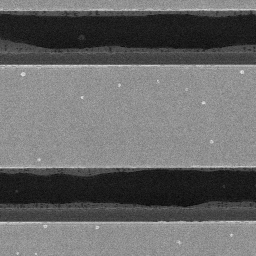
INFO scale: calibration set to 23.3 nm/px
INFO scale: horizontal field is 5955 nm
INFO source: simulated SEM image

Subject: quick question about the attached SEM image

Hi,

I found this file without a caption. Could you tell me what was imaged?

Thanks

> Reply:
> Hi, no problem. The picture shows lines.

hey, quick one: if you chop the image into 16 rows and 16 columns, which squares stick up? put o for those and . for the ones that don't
oooooooooooooooo
................
................
................
oooooooooooooooo
oooooooooooooooo
oooooooooooooooo
oooooooooooooooo
oooooooooooooooo
oooooooooooooooo
................
................
................
................
oooooooooooooooo
oooooooooooooooo